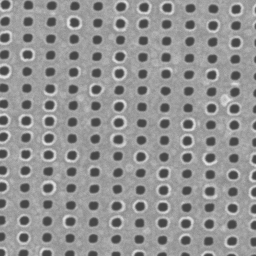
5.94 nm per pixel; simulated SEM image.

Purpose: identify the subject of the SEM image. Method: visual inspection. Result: a regular array of holes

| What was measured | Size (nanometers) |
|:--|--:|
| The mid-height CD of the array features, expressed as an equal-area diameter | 56.1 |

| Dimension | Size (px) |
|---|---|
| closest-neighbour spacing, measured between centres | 16.4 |